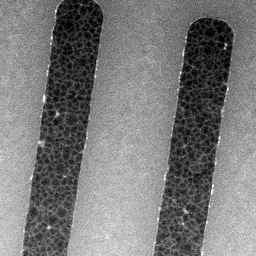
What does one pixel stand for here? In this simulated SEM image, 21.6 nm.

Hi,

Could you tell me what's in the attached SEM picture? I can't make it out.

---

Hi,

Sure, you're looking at one or a few lines or trenches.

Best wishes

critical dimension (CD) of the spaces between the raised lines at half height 1830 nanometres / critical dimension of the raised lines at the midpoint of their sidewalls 910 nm